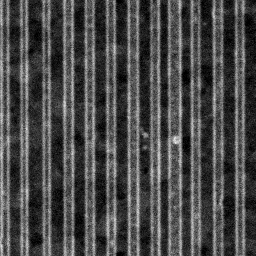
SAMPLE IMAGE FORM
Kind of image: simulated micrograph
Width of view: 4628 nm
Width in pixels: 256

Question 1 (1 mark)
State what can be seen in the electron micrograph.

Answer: parallel lines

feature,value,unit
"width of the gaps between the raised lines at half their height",129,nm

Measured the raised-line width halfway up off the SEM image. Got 258 nm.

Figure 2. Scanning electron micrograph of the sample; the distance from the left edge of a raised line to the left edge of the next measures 388 nm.